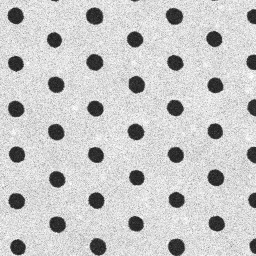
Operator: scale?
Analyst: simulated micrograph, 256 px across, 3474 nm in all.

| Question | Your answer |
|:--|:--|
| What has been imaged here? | a regular array of holes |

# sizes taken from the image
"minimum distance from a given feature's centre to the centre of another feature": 614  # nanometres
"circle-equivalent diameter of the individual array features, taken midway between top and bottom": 0.22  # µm